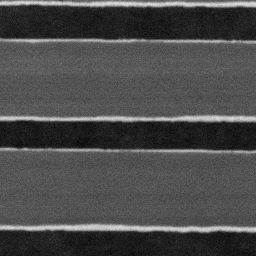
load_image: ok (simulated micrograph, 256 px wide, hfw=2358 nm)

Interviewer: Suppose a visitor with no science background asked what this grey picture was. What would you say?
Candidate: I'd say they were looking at lines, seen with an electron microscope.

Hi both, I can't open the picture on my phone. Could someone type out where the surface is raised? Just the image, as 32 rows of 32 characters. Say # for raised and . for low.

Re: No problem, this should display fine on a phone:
.........#############.#########
................................
................................
................................
................................
################################
################################
################################
################################
################################
################################
################################
################################
################################
################################
................................
................................
................................
................................
################################
################################
################################
################################
################################
################################
################################
################################
################################
################################
................................
................................
................................